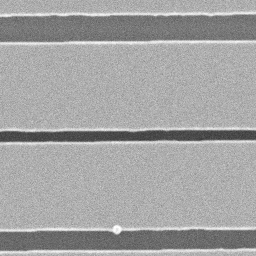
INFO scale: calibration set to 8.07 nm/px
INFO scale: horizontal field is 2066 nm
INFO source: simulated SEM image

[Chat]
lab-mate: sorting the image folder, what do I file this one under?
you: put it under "lines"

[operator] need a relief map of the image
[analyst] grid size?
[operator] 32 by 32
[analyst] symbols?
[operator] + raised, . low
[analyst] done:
++++++++++++++++++++++++++++++++
++++++++++++++++++++++++++++++++
................................
................................
................................
++++++++++++++++++++++++++++++++
++++++++++++++++++++++++++++++++
++++++++++++++++++++++++++++++++
++++++++++++++++++++++++++++++++
++++++++++++++++++++++++++++++++
++++++++++++++++++++++++++++++++
++++++++++++++++++++++++++++++++
++++++++++++++++++++++++++++++++
++++++++++++++++++++++++++++++++
++++++++++++++++++++++++++++++++
++++++++++++++++++++++++++++++++
................................
................................
++++++++++++++++++++++++++++++++
++++++++++++++++++++++++++++++++
++++++++++++++++++++++++++++++++
++++++++++++++++++++++++++++++++
++++++++++++++++++++++++++++++++
++++++++++++++++++++++++++++++++
++++++++++++++++++++++++++++++++
++++++++++++++++++++++++++++++++
++++++++++++++++++++++++++++++++
++++++++++++++++++++++++++++++++
++++++++++++++++++++++++++++++++
................................
................................
++++++++++++++++++++++++++++++++